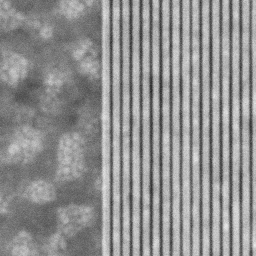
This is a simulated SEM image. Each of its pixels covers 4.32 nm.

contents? parallel lines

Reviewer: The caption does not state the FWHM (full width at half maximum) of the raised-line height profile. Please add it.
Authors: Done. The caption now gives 28.1 nanometres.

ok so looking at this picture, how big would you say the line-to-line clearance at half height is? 16.2 nm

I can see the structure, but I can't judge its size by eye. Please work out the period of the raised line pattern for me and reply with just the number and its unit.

43 nm